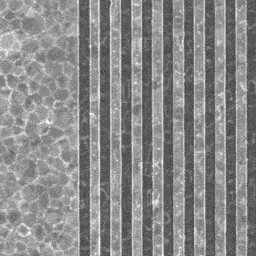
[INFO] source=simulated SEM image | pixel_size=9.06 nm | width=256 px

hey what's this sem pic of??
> parallel lines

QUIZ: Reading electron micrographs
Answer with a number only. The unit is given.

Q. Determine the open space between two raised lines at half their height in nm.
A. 97.4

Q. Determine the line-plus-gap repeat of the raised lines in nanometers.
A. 190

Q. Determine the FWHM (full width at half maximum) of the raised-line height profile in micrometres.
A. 0.0884